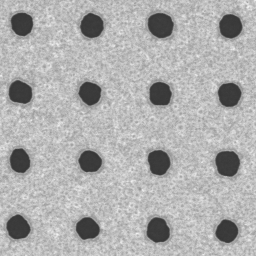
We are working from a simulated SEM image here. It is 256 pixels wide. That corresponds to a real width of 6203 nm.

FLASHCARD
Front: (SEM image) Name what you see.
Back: a regular array of holes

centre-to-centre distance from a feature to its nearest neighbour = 1650 nm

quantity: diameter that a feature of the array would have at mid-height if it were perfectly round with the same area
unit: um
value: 0.575